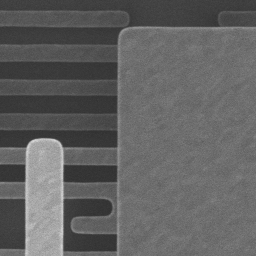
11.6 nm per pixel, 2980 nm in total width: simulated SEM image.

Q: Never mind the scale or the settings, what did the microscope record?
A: wiring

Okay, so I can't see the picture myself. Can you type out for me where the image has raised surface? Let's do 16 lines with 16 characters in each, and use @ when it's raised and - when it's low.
----------------
----------------
-------@@@@@@@@@
-------@@@@@@@@@
-------@@@@@@@@@
-------@@@@@@@@@
-------@@@@@@@@@
-------@@@@@@@@@
-------@@@@@@@@@
--@@---@@@@@@@@@
--@@---@@@@@@@@@
--@@---@@@@@@@@@
--@@---@@@@@@@@@
--@@---@@@@@@@@@
--@@---@@@@@@@@@
--@@---@@@@@@@@@